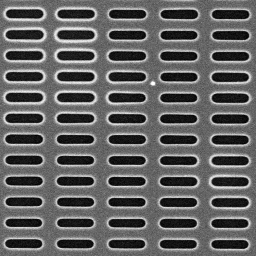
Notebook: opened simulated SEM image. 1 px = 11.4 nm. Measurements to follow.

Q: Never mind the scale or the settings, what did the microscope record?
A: groups of lines, slits or small figures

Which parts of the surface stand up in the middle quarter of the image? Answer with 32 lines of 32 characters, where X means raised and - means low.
XXXXXXXXXXXXXXXXXXXXXXXXXXXXXXXX
XXXXXXXXXXXXXXXXXXXXXXXXXXXXXXXX
-------XXXX---------XXXX--------
--------XXX----------XXX--------
-------XXXXX-------XXXXXX-------
XXXXXXXXXXXXXXXXXXXXXXXXXXXXXXXX
XXXXXXXXXXXXXXXXXXXXXXXXXXXXXXXX
-------XXXX--------XXXXXX-------
--------XXX----------XXX--------
-------XXXX---------XXXXX-------
XXXXXXXXXXXXXXXXXXXXXXXXXXXXXXXX
XXXXXXXXXXXXXXXXXXXXXXXXXXXXXXXX
-------XXXXX------XXXXXXXXXXXXXX
--------XXX----------XXX--------
-------XXXX---------XXXX--------
XXXXXXXXXXXXXXXXXXXXXXXXXXXXXXXX
XXXXXXXXXXXXXXXXXXXXXXXXXXXXXXXX
XXXXXXXXXXXXXXXXXXXXXXXXXXXXXXXX
-------XXXX---------XXXX--------
-------XXXX---------XXXX--------
XXXXXXXXXXXXXXXXXXXXXXXXXXXXXXXX
XXXXXXXXXXXXXXXXXXXXXXXXXXXXXXXX
XXXXXXXXXXXXXXXXXXXXXXXXXXXXXXXX
-------XXXX---------XXXX--------
-------XXXX---------XXXX--------
XXXXXXXXXXXXXXXXXXXXXXXXXXXXXXXX
XXXXXXXXXXXXXXXXXXXXXXXXXXXXXXXX
XXXXXXXXXXXXXXXXXXXXXXXXXXXXXXXX
-------XXXXX--------XXXX--------
-------XXXX---------XXXX--------
------XXXXXX-------XXXXXX-------
XXXXXXXXXXXXXXXXXXXXXXXXXXXXXXXX